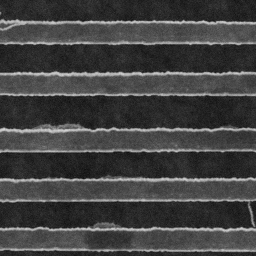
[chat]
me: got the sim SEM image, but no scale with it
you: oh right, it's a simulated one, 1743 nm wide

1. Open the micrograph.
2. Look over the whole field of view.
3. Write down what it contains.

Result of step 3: lines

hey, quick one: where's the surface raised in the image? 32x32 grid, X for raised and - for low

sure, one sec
--------------------------------
--------------------------------
--------------------------------
XXXXXXXXXXXXXXXXXXXXXXXXXXXXXXXX
XXXXXXXXXXXXXXXXXXXXXXXXXXXXXXXX
X-X--XX-XX---X----X-------X--X--
--------------------------------
--------------------------------
--------------------------------
XXXXXXXXXXXXXXXXXXXXXXXXXXXXXXXX
XXXXXXXXXXXXXXXXXXXXXXXXXXXXXXXX
XXXXXXXXXXXXXXXXXXXXXXXXXXXXXXXX
--------------------------------
--------------------------------
--------------------------------
--------------------------------
XXXXXXXXXXXXXXXXXXXXXXXXXXXXXXXX
XXXXXXXXXXXXXXXXXXXXXXXXXXXXXXXX
XXXXXXXXXXXXXXXXXXXXXXXXXXXXXXXX
--------------------------------
--------------------------------
--------------------------------
XXXXXXXXXXXXXXXXXXXXXXXXXXXXXXXX
XXXXXXXXXXXXXXXXXXXXXXXXXXXXXXXX
XXXXXXXXXXXXXXXXXXXXXXXXXXXXXXXX
--------------------------------
--------------------------------
--------------------------------
-----X--------------------------
XXXXXXXXXXXXXXXXXXXXXXXXXXXXXXXX
XXXXXXXXXXXXXXXXXXXXXXXXXXXXXXXX
--------------------------------